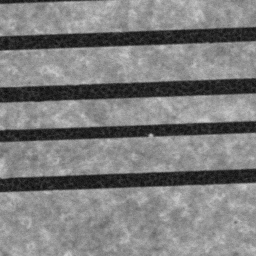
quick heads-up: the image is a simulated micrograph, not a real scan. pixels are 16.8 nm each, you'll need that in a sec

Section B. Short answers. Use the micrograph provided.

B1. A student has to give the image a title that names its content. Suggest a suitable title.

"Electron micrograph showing parallel lines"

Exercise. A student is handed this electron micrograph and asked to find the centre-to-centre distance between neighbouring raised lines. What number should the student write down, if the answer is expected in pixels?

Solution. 45.4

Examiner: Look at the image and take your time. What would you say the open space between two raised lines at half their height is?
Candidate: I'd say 0.254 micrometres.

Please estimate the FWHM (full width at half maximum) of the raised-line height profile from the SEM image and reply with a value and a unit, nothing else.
589 nanometers